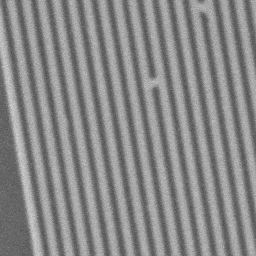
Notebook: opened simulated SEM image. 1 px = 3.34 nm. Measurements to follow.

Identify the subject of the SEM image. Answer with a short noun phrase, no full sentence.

parallel lines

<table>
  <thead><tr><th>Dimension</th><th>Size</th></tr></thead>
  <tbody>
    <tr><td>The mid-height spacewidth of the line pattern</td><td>7.87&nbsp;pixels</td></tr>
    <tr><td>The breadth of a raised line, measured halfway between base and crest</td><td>23.4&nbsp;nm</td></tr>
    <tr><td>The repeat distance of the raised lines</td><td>50.1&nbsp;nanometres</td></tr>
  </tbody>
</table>